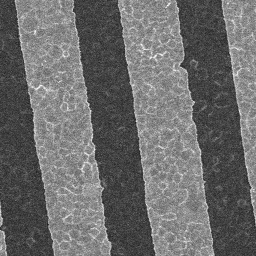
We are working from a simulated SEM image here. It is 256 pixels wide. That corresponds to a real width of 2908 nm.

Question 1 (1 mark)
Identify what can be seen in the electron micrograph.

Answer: one or a few lines or trenches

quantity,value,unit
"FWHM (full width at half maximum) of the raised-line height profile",644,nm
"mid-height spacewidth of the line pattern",510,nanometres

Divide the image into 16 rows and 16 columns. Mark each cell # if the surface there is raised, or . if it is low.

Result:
.####..####...##
.####...###...##
.####...###...##
.####...###...##
..###...####...#
..###...####...#
..####..####...#
..####...###...#
..####...###...#
..####...####..#
...###...####..#
...###...####...
...###...####...
...###...####...
...####..####...
...####...###...